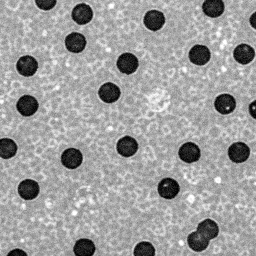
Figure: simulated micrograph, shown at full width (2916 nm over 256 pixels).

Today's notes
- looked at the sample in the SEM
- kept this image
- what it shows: a regular array of holes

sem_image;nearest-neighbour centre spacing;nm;468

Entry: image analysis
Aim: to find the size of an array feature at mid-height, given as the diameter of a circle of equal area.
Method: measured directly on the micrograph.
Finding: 262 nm